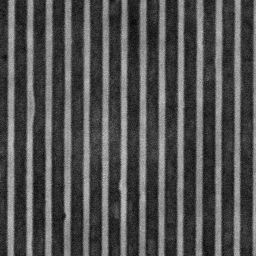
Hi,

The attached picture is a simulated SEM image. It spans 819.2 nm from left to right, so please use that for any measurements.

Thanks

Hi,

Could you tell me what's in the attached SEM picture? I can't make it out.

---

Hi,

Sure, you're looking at parallel lines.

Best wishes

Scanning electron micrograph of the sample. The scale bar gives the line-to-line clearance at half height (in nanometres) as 41.5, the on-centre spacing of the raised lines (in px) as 18.8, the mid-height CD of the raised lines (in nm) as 18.